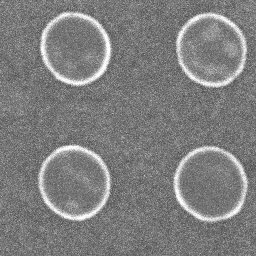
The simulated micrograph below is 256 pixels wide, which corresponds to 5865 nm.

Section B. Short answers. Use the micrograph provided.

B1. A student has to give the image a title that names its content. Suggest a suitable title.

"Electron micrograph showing raised bodies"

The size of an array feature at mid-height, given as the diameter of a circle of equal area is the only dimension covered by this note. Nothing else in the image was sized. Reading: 70.2 pixels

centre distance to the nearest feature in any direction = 3070 nm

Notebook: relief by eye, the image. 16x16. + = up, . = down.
................
...+++......+++.
...++++....++++.
...++++....++++.
...+++......+++.
................
................
................
................
...+++......++..
...++++....++++.
...++++....++++.
...++++....++++.
....+.......++..
................
................